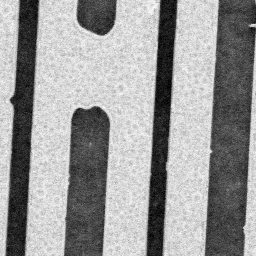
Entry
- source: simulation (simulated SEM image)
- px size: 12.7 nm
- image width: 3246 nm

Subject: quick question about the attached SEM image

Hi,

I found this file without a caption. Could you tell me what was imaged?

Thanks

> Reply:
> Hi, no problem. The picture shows one or a few lines or trenches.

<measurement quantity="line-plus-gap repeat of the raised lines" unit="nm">879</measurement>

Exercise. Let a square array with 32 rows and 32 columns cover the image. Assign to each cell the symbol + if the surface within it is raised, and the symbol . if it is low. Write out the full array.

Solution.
++...++++......+++++..+++++.....
++...++++......+++++..+++++.....
++...++++......+++++..+++++.....
++...+++++....++++++..+++++.....
++...+++++++.+++++++..+++++.....
++...+++++++++++++++..+++++.....
++...+++++++++++++++..+++++.....
++...++++++++++++++...+++++.....
++...++++++++++++++...+++++.....
++...++++++++++++++...+++++.....
++...++++++++++++++...++++......
++..+++++++++++++++...+++++.....
+...+++++++++++++++...++++......
+...++++++...++++++..+++++......
+...+++++.....+++++..+++++......
+...+++++.....+++++..+++++.....+
+...+++++.....+++++..+++++.....+
+...+++++.....+++++..+++++.....+
+...+++++.....+++++..+++++.....+
+...+++++.....+++++..+++++.....+
+...++++......+++++..+++++.....+
+...++++......+++++..+++++.....+
+...++++......+++++..+++++.....+
+...++++.....++++++..+++++.....+
+...++++.....+++++...+++++.....+
+...++++.....+++++...+++++.....+
+...++++.....+++++...+++++.....+
+...++++.....+++++...+++++.....+
+..+++++.....+++++...+++++.....+
+..+++++.....+++++...+++++.....+
+..+++++.....+++++...+++++.....+
+..+++++.....+++++...++++......+